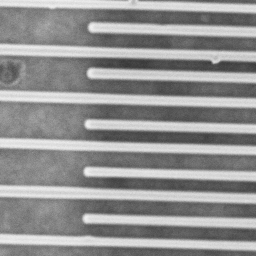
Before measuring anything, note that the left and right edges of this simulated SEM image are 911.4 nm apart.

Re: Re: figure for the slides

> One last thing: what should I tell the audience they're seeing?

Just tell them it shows parallel lines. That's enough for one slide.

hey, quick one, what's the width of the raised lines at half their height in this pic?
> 30.3 nm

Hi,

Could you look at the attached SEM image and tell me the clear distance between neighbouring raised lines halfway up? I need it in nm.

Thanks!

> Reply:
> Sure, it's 54.7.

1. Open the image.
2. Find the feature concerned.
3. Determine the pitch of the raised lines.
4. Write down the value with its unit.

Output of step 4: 84.6 nanometers